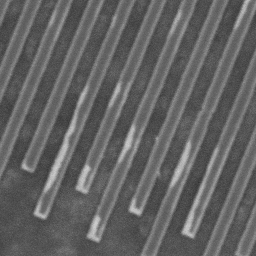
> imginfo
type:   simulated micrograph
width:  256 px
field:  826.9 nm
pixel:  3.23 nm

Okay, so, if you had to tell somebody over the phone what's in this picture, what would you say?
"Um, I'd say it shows parallel lines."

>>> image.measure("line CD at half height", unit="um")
0.0423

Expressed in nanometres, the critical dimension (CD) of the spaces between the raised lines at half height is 51.3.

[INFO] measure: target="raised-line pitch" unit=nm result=93.2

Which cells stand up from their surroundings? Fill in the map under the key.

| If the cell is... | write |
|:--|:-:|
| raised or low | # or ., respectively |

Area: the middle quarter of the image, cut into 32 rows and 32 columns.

###.....###....####....###.....#
###....###.....###.....###.....#
##.....###.....###....####....##
##....####....###.....###.....##
#.....###.....###.....###....###
#....####....####....###.....###
#....###.....###.....###....####
....####....####....####....###.
....####....####....###.....###.
...####....####.....###....####.
...####....####....###.....###..
...###.....###.....###....####..
...###....####....####....###...
..####....###.....###.....###...
..###.....###.....###....####...
.####....####....###.....###....
.###.....###....####....####....
####....####....####....###.....
###.....###.....###....####.....
###.....###....####....###.....#
###....###.....###.....###....##
##.....###.....###....####....##
##....####....####....###.....##
#.....###.....###.....###....###
#.....###....####....###.....###
#....###.....####....###....####
.....###.....###....####....###.
....####....###.....###.....###.
....###.....###.....###....####.
....###....####....###.....###..
...###.....###.....###....####..
...###.....###....####....###...